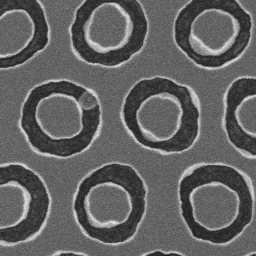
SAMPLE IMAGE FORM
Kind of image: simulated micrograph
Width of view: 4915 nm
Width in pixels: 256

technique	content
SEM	ring-shaped grooves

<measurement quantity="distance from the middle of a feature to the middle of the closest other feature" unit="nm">1910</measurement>